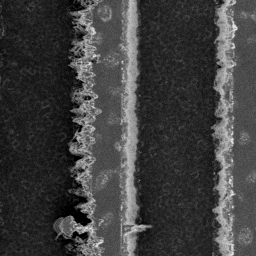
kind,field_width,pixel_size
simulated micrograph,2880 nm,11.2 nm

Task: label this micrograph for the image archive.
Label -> one or a few lines or trenches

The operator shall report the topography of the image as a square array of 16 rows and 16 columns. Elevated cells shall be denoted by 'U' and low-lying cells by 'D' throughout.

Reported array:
DDDDDUUUDDDDDDUU
DDDDDUUUDDDDDDUU
DDDDDUUUDDDDDDUU
DDDDDUUUDDDDDDUU
DDDDDUUUDDDDDDUU
DDDDDUUUDDDDDDUU
DDDDDUUUDDDDDDUU
DDDDDUUUDDDDDDUU
DDDDDUUUDDDDDDUU
DDDDDUUUDDDDDDUU
DDDDDUUUDDDDDDUU
DDDDDUUUDDDDDDUU
DDDDDUUUDDDDDDUU
DDDDDUUUDDDDDDUU
DDDDUUUUDDDDDDUU
DDDDDUUUDDDDDDUU